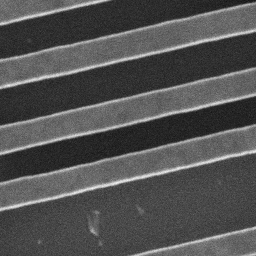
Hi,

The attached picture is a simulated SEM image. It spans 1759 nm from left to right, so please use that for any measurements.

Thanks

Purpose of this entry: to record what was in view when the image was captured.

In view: lines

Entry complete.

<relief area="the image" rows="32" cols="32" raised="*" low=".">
************...................*
*******...................******
***...................**********
..................**************
.............****************...
.........****************.......
.....****************...........
****************................
************....................
********....................****
***....................*********
...................*************
...............***************..
..........****************......
......***************...........
.****************...............
*************...............****
********................********
****................************
...............***************..
...........***************......
......***************...........
..***************...............
************....................
********........................
****............................
................................
................................
...............................*
...........................*****
.......................*********
..................**************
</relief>